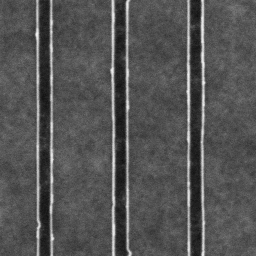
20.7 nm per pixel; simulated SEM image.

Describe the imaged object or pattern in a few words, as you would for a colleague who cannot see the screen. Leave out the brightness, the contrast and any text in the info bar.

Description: one or a few lines or trenches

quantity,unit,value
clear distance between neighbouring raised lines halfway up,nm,1260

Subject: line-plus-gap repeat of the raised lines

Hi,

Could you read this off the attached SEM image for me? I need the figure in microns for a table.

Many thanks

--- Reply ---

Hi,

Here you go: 1.56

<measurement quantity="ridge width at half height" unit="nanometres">310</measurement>